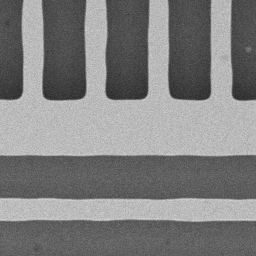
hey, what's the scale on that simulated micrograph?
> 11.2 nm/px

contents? groups of lines, slits or small figures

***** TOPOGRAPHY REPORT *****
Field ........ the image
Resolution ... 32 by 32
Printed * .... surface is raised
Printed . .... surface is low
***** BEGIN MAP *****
...**......**......**.....***...
...**......**......**.....***...
...**......**......**.....***...
...**......**......**.....***...
...**......**......**.....***...
...**......**......**.....***...
...**......**......**.....***...
...**......**......**.....***...
...**......**......**.....***...
...**......**......**.....***...
...**......**......**.....***...
...**......**.....***.....***...
..****...*****...******...****..
********************************
********************************
********************************
********************************
********************************
********************************
................................
................................
................................
................................
................................
................................
********************************
********************************
****.......***.......***********
................................
................................
................................
................................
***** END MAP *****